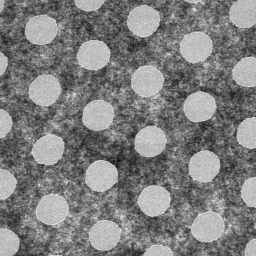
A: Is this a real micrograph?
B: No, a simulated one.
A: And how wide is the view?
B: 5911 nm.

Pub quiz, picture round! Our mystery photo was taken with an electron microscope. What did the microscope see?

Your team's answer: a regular array of raised bodies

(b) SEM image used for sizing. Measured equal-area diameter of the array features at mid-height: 717 nm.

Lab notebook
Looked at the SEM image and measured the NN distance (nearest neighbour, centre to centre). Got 1.35 micrometres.